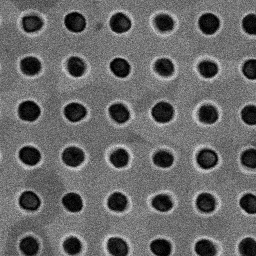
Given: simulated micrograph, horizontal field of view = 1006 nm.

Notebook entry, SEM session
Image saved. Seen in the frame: a regular array of holes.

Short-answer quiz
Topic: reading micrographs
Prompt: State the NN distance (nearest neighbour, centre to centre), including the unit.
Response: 171 nanometres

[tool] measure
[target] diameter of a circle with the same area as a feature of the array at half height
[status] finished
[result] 0.0857 microns